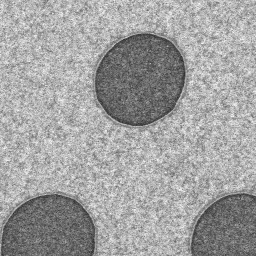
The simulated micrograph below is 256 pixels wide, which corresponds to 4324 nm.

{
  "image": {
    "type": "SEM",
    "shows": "holes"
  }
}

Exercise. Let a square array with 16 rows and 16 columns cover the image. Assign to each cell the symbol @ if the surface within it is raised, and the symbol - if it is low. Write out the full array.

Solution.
@@@@@@@@@@@@@@@@
@@@@@@@@@@@@@@@@
@@@@@@@@--@@@@@@
@@@@@@@----@@@@@
@@@@@@------@@@@
@@@@@@-----@@@@@
@@@@@@-----@@@@@
@@@@@@@---@@@@@@
@@@@@@@@@@@@@@@@
@@@@@@@@@@@@@@@@
@@@@@@@@@@@@@@@@
@@@@@@@@@@@@@@@@
@@---@@@@@@@@@--
@-----@@@@@@@---
------@@@@@@----
------@@@@@@----